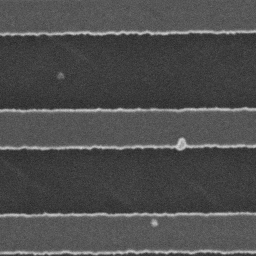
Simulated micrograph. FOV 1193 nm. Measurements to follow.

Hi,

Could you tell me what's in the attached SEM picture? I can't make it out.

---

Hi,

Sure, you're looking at lines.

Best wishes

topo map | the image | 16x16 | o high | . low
oooooooooooooooo
oooooooooooooooo
................
................
................
................
................
oooooooooooooooo
oooooooooooooooo
................
................
................
................
oooooooooooooooo
oooooooooooooooo
oooooooooooooooo